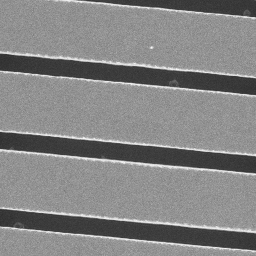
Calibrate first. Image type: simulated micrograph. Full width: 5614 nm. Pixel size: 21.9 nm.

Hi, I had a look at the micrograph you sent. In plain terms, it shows lines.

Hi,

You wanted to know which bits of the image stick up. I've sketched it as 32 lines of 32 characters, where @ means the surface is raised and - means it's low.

@@@@@@@@@@@@@@------------------
@@@@@@@@@@@@@@@@@@@@@@@@@-------
@@@@@@@@@@@@@@@@@@@@@@@@@@@@@@@@
@@@@@@@@@@@@@@@@@@@@@@@@@@@@@@@@
@@@@@@@@@@@@@@@@@@@@@@@@@@@@@@@@
@@@@@@@@@@@@@@@@@@@@@@@@@@@@@@@@
@@@@@@@@@@@@@@@@@@@@@@@@@@@@@@@@
---------@@@@@@@@@@@@@@@@@@@@@@@
-------------------@@@@@@@@@@@@@
@@@@@@-----------------------@@@
@@@@@@@@@@@@@@@@@---------------
@@@@@@@@@@@@@@@@@@@@@@@@@@@@----
@@@@@@@@@@@@@@@@@@@@@@@@@@@@@@@@
@@@@@@@@@@@@@@@@@@@@@@@@@@@@@@@@
@@@@@@@@@@@@@@@@@@@@@@@@@@@@@@@@
@@@@@@@@@@@@@@@@@@@@@@@@@@@@@@@@
@@@@@@@@@@@@@@@@@@@@@@@@@@@@@@@@
------------@@@@@@@@@@@@@@@@@@@@
----------------------@@@@@@@@@@
@@@@@@@@@-----------------------
@@@@@@@@@@@@@@@@@@@-------------
@@@@@@@@@@@@@@@@@@@@@@@@@@@@@@--
@@@@@@@@@@@@@@@@@@@@@@@@@@@@@@@@
@@@@@@@@@@@@@@@@@@@@@@@@@@@@@@@@
@@@@@@@@@@@@@@@@@@@@@@@@@@@@@@@@
@@@@@@@@@@@@@@@@@@@@@@@@@@@@@@@@
----@@@@@@@@@@@@@@@@@@@@@@@@@@@@
--------------@@@@@@@@@@@@@@@@@@
@@----------------------@@@@@@@@
@@@@@@@@@@@@--------------------
@@@@@@@@@@@@@@@@@@@@@@----------
@@@@@@@@@@@@@@@@@@@@@@@@@@@@@@@@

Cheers